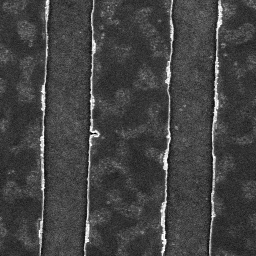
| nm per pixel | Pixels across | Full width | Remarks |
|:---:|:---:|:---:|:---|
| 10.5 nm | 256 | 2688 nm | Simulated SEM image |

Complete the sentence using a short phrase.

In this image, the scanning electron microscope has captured one or a few lines or trenches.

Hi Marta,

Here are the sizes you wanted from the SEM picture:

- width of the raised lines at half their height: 824 nm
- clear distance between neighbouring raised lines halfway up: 476 nm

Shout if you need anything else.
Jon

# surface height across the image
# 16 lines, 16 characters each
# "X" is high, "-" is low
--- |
XXX---XXXXX---XX
XXX---XXXXX---XX
XXX---XXXXX---XX
XXX---XXXXX---XX
XXX---XXXXX--XXX
XXX---XXXXX--XXX
XXX---XXXXX--XXX
XXX---XXXXX--XXX
XXX---XXXXX--XXX
XXX---XXXX---XXX
XXX---XXXX---XXX
XXX---XXXX---XXX
XXX--XXXXX---XXX
XXX--XXXXX---XXX
XXX--XXXXX---XXX
XXX--XXXXX---XXX